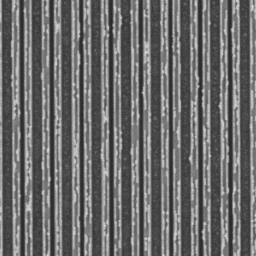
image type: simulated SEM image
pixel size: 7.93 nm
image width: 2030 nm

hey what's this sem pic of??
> parallel lines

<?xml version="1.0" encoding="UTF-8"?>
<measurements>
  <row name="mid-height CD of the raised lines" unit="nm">62.4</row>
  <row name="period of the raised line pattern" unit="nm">116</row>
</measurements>